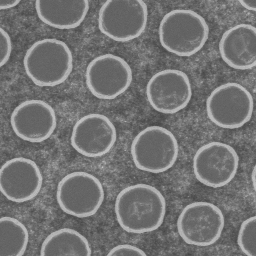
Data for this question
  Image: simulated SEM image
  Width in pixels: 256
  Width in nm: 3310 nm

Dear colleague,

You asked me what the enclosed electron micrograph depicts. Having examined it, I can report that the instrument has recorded a regular array of raised bodies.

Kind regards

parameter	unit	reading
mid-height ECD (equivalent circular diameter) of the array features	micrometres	0.553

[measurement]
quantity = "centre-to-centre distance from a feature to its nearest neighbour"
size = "782 nm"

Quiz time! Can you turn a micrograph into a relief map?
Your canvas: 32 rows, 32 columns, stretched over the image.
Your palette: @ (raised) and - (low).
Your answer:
@@---@@@@@@--@@@@@------------@@
-----@@@@@@--@@@@@----@@--------
------@@@@---@@@@@--@@@@@-------
-------------@@@@@--@@@@@@---@@@
@-------------@@@---@@@@@@--@@@@
@----@@@------------@@@@@---@@@@
@---@@@@@-------------@@----@@@@
@--@@@@@@---@@@-------------@@@@
---@@@@@@--@@@@@----------------
----@@@@---@@@@@----@@@---------
-----@-----@@@@@---@@@@---------
------------@@@----@@@@@---@@@@-
-------------------@@@@---@@@@@-
--@@@@--------------@@----@@@@@-
--@@@@@-------------------@@@@@-
--@@@@@---@@@@-------------@@@--
--@@@@---@@@@@----@@@-----------
----@----@@@@@---@@@@@----------
----------@@@@---@@@@@----@@@---
-----------------@@@@@---@@@@---
-@@@-------------@@@@---@@@@@@--
@@@@@--------------------@@@@---
@@@@@---@@@@-------------@@@@---
@@@@@--@@@@@@---@@@-------------
-@@@---@@@@@@--@@@@@------------
--------@@@@---@@@@@-----@------
---------@@@---@@@@@---@@@@-----
@@-------------@@@@@---@@@@@---@
@@@-------------@@@----@@@@@--@@
@@@---@@@@-------------@@@@---@@
@@@---@@@@@--------------@----@@
@@@--@@@@@@---@@@@-------------@